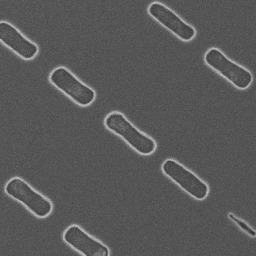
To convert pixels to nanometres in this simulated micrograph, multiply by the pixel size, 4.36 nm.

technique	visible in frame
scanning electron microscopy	holes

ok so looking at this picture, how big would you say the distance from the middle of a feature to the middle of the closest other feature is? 322 nanometers